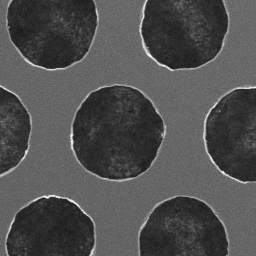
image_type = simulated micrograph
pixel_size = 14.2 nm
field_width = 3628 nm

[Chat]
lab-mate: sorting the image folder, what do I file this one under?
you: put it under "holes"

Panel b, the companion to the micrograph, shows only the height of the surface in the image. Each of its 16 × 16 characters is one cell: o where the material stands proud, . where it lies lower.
o.....ooo.....oo
......ooo.....oo
o.....ooo.....oo
oo...ooooo...ooo
oooooooooooooooo
oooooo..oooooooo
.oooo....ooooo..
..ooo.....ooo...
..ooo.....ooo...
..ooo.....ooo...
.oooo....ooooo..
oooooooooooooooo
oo..oooooo..oooo
o....oooo.....oo
o.....ooo.....oo
......ooo.....oo